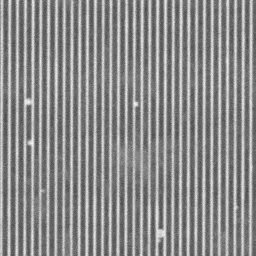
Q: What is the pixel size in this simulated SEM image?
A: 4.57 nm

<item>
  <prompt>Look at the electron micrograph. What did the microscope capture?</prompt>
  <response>parallel lines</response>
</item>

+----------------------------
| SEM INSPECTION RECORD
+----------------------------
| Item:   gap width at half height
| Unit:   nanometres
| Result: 28.5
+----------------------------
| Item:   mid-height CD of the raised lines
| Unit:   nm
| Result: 6.8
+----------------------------